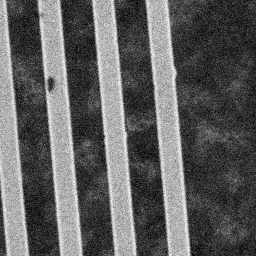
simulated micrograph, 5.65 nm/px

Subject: parallel lines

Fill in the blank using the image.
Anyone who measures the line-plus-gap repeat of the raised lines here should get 304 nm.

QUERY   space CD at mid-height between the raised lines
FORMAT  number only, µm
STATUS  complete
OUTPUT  0.187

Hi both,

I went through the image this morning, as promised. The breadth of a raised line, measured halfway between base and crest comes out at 0.118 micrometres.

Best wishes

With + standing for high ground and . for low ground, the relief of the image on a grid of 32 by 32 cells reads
+....++.....++....+++...........
+....+++....++....+++...........
+....+++....++.....++...........
+....+++....+++....++...........
+....+++....+++....++...........
+....+++....+++....++...........
+....+++....+++....++...........
+.....++....+++....+++..........
+.....++....+++....+++..........
+.....++....+++....+++..........
++....++.....++....+++..........
++....++.....++....+++..........
++....+++....++....+++..........
++....+++....++....+++..........
++....+++....++.....++..........
++....+++....++.....++..........
++....+++....+++....++..........
++....+++....+++....++..........
++....+++....+++....+++.........
++.....++....+++....+++.........
++.....++....+++....+++.........
+++....++.....++....+++.........
+++....++.....++....+++.........
+++....++.....++....+++.........
+++....+++....++.....++.........
+++....+++....++.....++.........
+++....+++....++.....++.........
.++....+++....+++....++.........
.++....+++....+++....++.........
.++....+++....+++....++.........
.++.....++....+++....+++........
.++.....++....+++....+++........